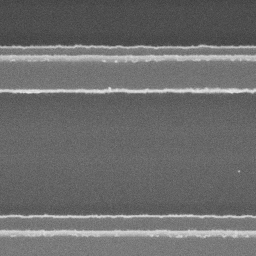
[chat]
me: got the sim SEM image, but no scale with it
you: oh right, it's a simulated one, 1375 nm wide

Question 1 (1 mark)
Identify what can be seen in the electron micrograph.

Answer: lines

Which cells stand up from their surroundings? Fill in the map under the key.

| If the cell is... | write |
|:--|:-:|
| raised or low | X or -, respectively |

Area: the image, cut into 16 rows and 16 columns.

----------------
----------------
----------------
XXXXXXXXXXXXXXXX
XXXXXXXXXXXXXXXX
XXXXXXXXXXXXXXXX
----------------
----------------
----------------
----------------
----------------
----------------
----------------
--X------X-X----
XXXXXXXXXXXXXXXX
XXXXXXXXXXXXXXXX